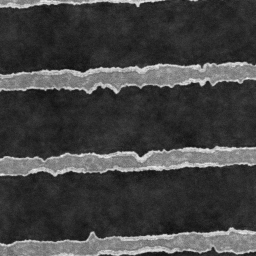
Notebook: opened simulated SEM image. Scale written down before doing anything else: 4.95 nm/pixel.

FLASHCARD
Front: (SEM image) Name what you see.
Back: one or a few lines or trenches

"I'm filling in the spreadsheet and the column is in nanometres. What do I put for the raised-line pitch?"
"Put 417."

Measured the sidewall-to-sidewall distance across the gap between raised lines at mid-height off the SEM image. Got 331 nm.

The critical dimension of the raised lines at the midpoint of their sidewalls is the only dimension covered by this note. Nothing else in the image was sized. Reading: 0.0859 µm